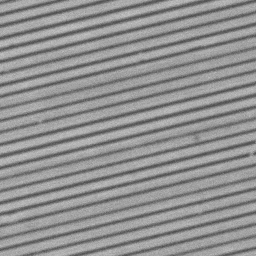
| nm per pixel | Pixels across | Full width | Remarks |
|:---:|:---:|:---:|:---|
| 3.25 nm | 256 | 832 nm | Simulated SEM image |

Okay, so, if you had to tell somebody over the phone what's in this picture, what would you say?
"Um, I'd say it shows parallel lines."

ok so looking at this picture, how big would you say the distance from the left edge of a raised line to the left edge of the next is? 37.2 nanometres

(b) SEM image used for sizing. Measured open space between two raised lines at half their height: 9.5 nm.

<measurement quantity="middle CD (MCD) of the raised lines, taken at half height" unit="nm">27.7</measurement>